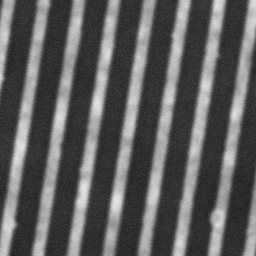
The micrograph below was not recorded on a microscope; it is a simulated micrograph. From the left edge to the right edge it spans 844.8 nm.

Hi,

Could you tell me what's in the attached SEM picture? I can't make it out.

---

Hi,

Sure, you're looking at parallel lines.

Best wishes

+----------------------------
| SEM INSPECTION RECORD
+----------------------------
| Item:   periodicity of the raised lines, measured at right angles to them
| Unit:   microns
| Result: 0.115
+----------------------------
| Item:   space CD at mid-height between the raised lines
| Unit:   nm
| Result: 80.6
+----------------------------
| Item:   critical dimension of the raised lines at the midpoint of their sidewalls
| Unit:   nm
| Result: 34.2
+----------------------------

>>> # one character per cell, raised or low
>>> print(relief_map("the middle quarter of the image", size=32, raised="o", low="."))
oo.......oo.......oo......ooo...
oo.......oo......ooo......ooo...
oo......ooo......ooo......oo....
oo......ooo......ooo......oo....
oo......ooo......oo.......oo....
oo......oo.......oo.......oo....
o.......oo.......oo......ooo....
o......ooo......ooo......ooo....
o......ooo......ooo......ooo....
o......ooo......ooo......oo.....
o......ooo......oo.......oo.....
o......oo.......oo.......oo.....
o......oo.......oo......ooo.....
......ooo......ooo......ooo.....
......ooo......ooo......ooo.....
......ooo......ooo......oo......
......ooo......oo.......oo......
......oo.......oo.......oo......
......oo.......oo......ooo......
......oo......ooo......ooo......
......oo......ooo......ooo......
.....ooo......ooo......oo.......
.....ooo......oo.......oo.......
.....ooo......oo.......oo......o
.....oo.......oo......ooo......o
.....oo......ooo......ooo......o
....ooo......ooo......ooo......o
....ooo......ooo......oo.......o
....ooo......oo.......oo.......o
....ooo......oo.......oo......oo
....oo.......oo......ooo......oo
....oo.......oo......ooo......oo